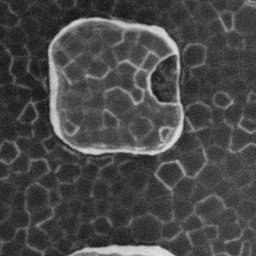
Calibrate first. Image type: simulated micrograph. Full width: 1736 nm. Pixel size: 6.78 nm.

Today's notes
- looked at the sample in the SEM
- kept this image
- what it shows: raised bodies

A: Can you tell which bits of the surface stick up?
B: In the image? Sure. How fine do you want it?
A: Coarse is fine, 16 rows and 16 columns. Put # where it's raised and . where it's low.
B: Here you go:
................
....####........
...########.....
...########.....
...#######......
...######.......
...########.....
...########.....
....#######.....
......#.##......
................
................
................
................
................
................